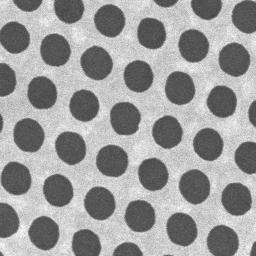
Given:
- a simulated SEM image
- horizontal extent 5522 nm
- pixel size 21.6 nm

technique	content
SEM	a regular array of holes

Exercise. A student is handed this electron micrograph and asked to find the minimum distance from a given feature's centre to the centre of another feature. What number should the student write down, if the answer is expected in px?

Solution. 43.2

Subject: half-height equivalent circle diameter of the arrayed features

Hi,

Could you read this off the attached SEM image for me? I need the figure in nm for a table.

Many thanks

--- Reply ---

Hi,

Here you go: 698